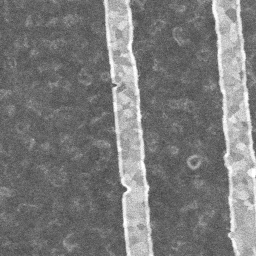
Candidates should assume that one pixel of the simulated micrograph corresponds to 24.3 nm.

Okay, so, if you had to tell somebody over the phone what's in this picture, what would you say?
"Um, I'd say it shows one or a few lines or trenches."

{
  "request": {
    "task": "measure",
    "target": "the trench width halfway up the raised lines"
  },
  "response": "2070 nanometers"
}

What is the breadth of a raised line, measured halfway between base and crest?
553 nm